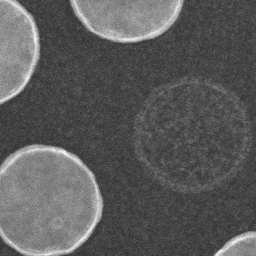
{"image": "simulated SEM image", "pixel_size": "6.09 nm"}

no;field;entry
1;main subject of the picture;raised bodies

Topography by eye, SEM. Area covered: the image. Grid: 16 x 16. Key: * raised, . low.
*....******.....
**...******.....
**.....**.......
**..............
**..............
*...............
................
................
................
.***............
*****...........
******..........
******..........
******..........
******..........
.****.........**